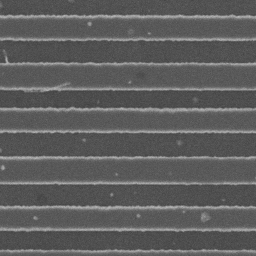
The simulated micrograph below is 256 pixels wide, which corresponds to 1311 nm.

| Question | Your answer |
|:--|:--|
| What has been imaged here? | lines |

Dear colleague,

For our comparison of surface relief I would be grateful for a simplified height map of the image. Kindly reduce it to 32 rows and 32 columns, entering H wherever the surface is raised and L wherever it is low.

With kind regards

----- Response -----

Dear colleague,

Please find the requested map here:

LLLLLLLLLLLLLLLLLLLLLLLLLLLLLLLL
LLLLLLLLLLLLLLLLLLLLLLLLLLLLLLLL
HHHHHHHHHHHHHHHHHHHHHHHHHHHHHHHH
HHHHHHHHHHHHHHHHHHHHHHHHHHHHHHHH
HHHHHHHHHHHHHHHHHHHHHHHHHHHHHHHH
LLLLLLLLLLLLLLLLLLLLLLLLLLLLLLLL
LLLLLLLLLLLLLLLLLLLLLLLLLLLLLLLL
LLLLLLLLLLLLLLLLLLLLLLLLLLLLLLLL
HHHHHHHHHHHHHHHHHHHHHHHHHHHHHHHH
HHHHHHHHHHHHHHHHHHHHHHHHHHHHHHHH
HHHHHHHHHHHHHHHHHHHHHHHHHHHHHHHH
LLLLLLLLLLLLLLLLLLLLLLLLLLLLLLLL
LLLLLLLLLLLLLLLLLLLLLLLLLLLLLLLL
LLLLLLLLLLLLLLLLLLLLLLLLLLLLLLLL
HHHHHHHHHHHHHHHHHHHHHHHHHHHHHHHH
HHHHHHHHHHHHHHHHHHHHHHHHHHHHHHHH
HHLLHLHHHHLHHHHHHHHHHHHHHHHHHHHH
LLLLLLLLLLLLLLLLLLLLLLLLLLLLLLLL
LLLLLLLLLLLLLLLLLLLLLLLLLLLLLLLL
LLLLLLLLLLLLLLLLLLLLLLLLLLLLLLLL
HHHHHHHHHHHHHHHHHHHHHHHHHHHHHHHH
HHHHHHHHHHHHHHHHHHHHHHHHHHHHHHHH
HHHHHHHHHHHHHHHHHHHHHHHHHHHHHHHH
LLLLLLLLLLLLLLLLLLLLLLLLLLLLLLLL
LLLLLLLLLLLLLLLLLLLLLLLLLLLLLLLL
LLLLLLLLLLLLLLLLLLLLLLLLLLLLLLLL
HHHHHHHHHHHHHHHHHHHHHHHHHHHHHHHH
HHHHHHHHHHHHHHHHHHHHHHHHHHHHHHHH
HHHHHHHHHHHHHHHHHHHHHHHHHHHHHHHH
LLLLLLLLLLLLLLLLLLLLLLLLLLLLLLLL
LLLLLLLLLLLLLLLLLLLLLLLLLLLLLLLL
HHHHHHHHHHHHHHHHHHHHHHHHHHHHHHHH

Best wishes